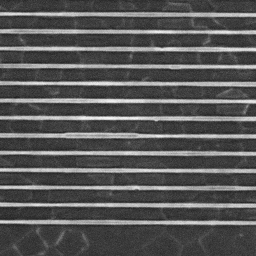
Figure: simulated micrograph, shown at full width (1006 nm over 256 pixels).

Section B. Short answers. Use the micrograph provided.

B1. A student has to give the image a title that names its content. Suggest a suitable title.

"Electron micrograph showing parallel lines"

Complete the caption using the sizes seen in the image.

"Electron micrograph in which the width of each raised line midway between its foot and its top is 9.8 nm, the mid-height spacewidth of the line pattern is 0.0565 microns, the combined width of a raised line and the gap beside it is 0.0682 µm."